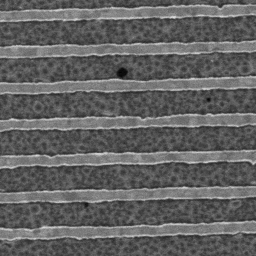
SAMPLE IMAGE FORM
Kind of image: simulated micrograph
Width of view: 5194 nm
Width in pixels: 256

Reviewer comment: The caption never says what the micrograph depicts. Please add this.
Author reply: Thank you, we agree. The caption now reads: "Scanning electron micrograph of parallel lines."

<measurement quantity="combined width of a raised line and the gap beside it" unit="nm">735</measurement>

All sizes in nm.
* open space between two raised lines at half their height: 525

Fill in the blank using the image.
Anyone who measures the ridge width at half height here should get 208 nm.